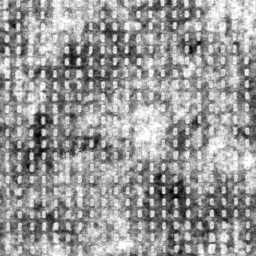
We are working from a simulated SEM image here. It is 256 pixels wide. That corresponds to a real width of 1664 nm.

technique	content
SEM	a regular array of raised bodies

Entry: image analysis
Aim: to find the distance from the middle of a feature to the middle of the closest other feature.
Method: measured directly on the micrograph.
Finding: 74.8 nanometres